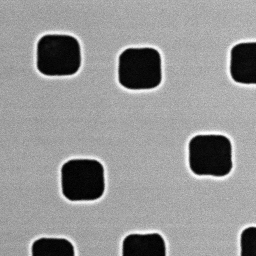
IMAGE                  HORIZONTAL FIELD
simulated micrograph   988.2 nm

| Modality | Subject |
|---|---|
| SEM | holes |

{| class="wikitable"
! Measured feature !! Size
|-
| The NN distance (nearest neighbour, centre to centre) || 376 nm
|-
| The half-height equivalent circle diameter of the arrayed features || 45.7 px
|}